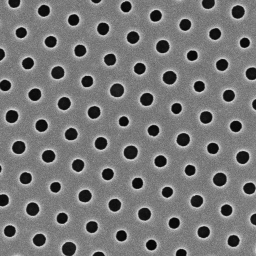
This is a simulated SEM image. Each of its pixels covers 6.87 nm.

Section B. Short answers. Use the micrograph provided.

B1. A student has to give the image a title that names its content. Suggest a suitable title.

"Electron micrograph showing a regular array of holes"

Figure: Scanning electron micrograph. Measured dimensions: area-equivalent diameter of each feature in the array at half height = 84.8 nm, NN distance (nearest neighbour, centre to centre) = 213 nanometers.